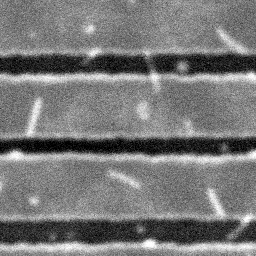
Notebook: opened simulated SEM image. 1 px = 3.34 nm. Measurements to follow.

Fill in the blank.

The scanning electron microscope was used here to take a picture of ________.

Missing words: lines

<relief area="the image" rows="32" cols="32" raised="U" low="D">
UUUUUUUUUUUUUUUUUUUUUUUUUUUUUUUU
UUUUUUUUUUUUUUUUUUUUUUUUUUUUUUUU
UUUUUUUUUUUUUUUUUUUUUUUUUUUUUUUU
UUUUUUUUUUUUUUUUUUUUUUUUUUUUUUUU
UUUUUUUUUUUUUUUUUUUUUUUUUUUUUUUU
UUUUUUUUUUUUUUUUUUUUUUUUUUUUUUUU
UUUUUUUUUUUUUUUUUUUUUUUUUUUUDUUU
DDDDDDDDDDDDDDDDDDDDDDDDDDDDDDDD
DDDDDDDDDDDDDDDDDDDDDDDDDDDDDDDD
UDUUUUUUUUUUUUUUUUDUUUDDUUUUUUUU
UUUUUUUUUUUUUUUUUUUUUUUUUUUUUUUU
UUUUUUUUUUUUUUUUUUUUUUUUUUUUUUUU
UUUUUUUUUUUUUUUUUUUUUUUUUUUUUUUU
UUUUUUUUUUUUUUUUUUUUUUUUUUUUUUUU
UUUUUUUUUUUUUUUUUUUUUUUUUUUUUUUU
UUUUUUUUUUUUUUUUUUUUUUUUUUUUUUUU
UUUUUUUUUUUUUUUUUUUUUUUUUUUUUUUU
DDDDDDDDDDDDDDDDDDDDDDDDDDDDDDDD
DDDDDDDDDDDDDDDDDDDDDDDDDDDDDDDD
UUUUUUUUUUUUUDUUUUDDDDDDDDDDUUUU
UUUUUUUUUUUUUUUUUUUUUUUUUUUUUUUU
UUUUUUUUUUUUUUUUUUUUUUUUUUUUUUUU
UUUUUUUUUUUUUUUUUUUUUUUUUUUUUUUU
UUUUUUUUUUUUUUUUUUUUUUUUUUUUUUUU
UUUUUUUUUUUUUUUUUUUUUUUUUUUUUUUU
UUUUUUUUUUUUUUUUUUUUUUUUUUUUUUUU
UUUUUUUUUUUUUUUUUUUUUUUUUUUUUUUU
DDDDDDDDDDDDDDDDDDDDDDDDDDDDDDDD
DDDDDDDDDDDDDDDDDDDDDDDDDDDDDDDD
DDDDDDDDDDDDDDDDDDDDDDDDDDDDDDDD
DDDDDDDDDUDDDDUDDDDDDDDDDDDDDDDD
UUUUUUUUUUUUUUUUUUUUUUUUUUUUUUUU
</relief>